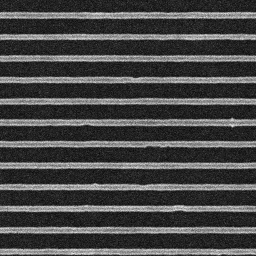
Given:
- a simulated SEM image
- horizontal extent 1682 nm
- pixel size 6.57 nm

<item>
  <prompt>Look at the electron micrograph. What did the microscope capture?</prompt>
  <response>parallel lines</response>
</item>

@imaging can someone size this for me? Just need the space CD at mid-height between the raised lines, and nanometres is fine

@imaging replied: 114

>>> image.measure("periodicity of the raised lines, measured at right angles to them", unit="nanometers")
141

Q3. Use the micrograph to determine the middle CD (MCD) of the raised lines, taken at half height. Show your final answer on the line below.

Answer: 0.0295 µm